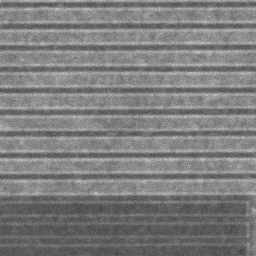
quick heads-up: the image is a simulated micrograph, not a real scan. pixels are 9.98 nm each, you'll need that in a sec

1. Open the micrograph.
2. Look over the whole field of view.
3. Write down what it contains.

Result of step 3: parallel lines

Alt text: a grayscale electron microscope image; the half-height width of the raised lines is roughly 140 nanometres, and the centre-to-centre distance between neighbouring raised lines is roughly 214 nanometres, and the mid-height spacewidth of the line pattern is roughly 78.6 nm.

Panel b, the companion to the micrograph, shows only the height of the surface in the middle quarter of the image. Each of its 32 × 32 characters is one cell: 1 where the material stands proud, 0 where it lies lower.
00000000000000000000000000000000
00000000000000000000000000000000
11111111111111111111111111111111
11111111111111111111111111111111
11111111111111111111111111111111
11111111111111111111111111111111
00000000000000000000000000000000
00000000000000000000000000000000
11111111111111111111111111111111
11111111111111111111111111111111
11111111111111111111111111111111
00000000000000000000000000000000
00000000000000000000000000000000
11111111111111111111111111111111
11111111111111111111111111111111
11111111111111111111111111111111
00000000000000000000000000000000
00000000000000000000000000000000
00000000000000000000000000000000
11111111111111111111111111111111
11111111111111111111111111111111
11111111111111111111111111111111
00000000000000000000000000000000
00000000000000000000000000000000
11111111111111111111111111111111
11111111111111111111111111111111
11111111111111111111111111111111
00000000000000000000000000000000
00000000000000000000000000000000
11111111111111111111111111111111
11111111111111111111111111111111
11111111111111111111111111111111